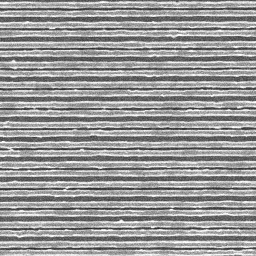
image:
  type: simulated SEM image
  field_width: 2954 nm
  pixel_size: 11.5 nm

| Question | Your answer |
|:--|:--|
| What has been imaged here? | parallel lines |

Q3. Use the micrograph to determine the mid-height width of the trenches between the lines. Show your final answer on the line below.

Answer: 60.6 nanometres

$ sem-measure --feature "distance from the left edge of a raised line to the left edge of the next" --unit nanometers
115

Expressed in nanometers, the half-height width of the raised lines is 70.7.